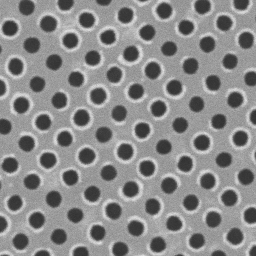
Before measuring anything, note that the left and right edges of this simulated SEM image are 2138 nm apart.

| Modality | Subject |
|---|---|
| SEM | a regular array of holes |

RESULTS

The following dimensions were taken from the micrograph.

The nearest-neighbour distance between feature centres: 224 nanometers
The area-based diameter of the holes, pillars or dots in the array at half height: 134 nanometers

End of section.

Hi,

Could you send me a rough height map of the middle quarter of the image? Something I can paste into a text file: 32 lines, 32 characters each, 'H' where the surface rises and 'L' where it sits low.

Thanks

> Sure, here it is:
HHHHHHHHHHHHHHHHHHHHLLLLHHHHHHLL
HHHHHHHHHHHLLLHHHHHHLLLLHHHHHHLL
HLLLLHHHHHHLLLHHHHHHLLLLHHHHHHHL
HLLLLHHHHHHLLLHHHHHHHLLHHHHHHHHH
HLLLLHHHHHHHLLHHHHHHHHHHHHLLLHHH
HHLLHHHHHHHHHHHHHLLHHHHHHHLLLLHH
HHHHHHHLLLHHHHHHLLLLHHHHHHLLLLHH
HHHHHHHLLLLHHHHHLLLLHHHHHHLLLHHH
LHHHHHHLLLLHHHHHHLLHHHHHHHHHHHHH
LHHHHHHLLLHHHHHHHHHHHHHLLHHHHHHL
HHHHHHHHHHHHHLLHHHHHHHLLLHHHHHHL
HHHHLHHHHHHHLLLLHHHHHHLLLLHHHHHH
HHHLLLHHHHHHLLLLHHHHHHLLLHHHHHHH
HHLLLLHHHHHHLLLHHHHHHHHHHHHHLLHH
HHHLLLHHHHHHHHHHHHHHHHHHHHHLLLLH
HHHHHHHHHHHHHHHHHHLLLHHHHHHLLLLH
HHHHHHHHLLLLHHHHHHLLLHHHHHHLLLLH
LLHHHHHHLLLLHHHHHHLLLHHHHHHHHHHH
LLHHHHHHLLLLHHHHHHHLHHHHHHHHHHHH
LLHHHHHHHLLHHHHHHHHHHHHHLLHHHHHH
LHHHHHHHHHHHHHLLLHHHHHHLLLLHHHHH
HHHHLLLHHHHHHLLLLHHHHHHLLLLHHHHH
HHHHLLLLHHHHHLLLLHHHHHHHLLHHHHHH
HHHHLLLLHHHHHHLLHHHHHHHHHHHHHLLL
HHHHLLLHHHHHHHHHHHHLLLHHHHHHHLLL
HHHHHHHHHHLLHHHHHHHLLLLHHHHHLLLL
HLHHHHHHHLLLLHHHHHHLLLLHHHHHHLLL
LLLHHHHHHLLLLHHHHHHLLLHHHHHHHHHH
LLLLHHHHHHLLLHHHHHHHHHHHHLLHHHHH
LLLHHHHHHHHHHHHHLHHHHHHHLLLLHHHH
HHHHHHHLHHHHHHHLLLHHHHHHLLLLHHHH
HHHHHLLLLHHHHHHLLLLHHHHHHLLLHHHH